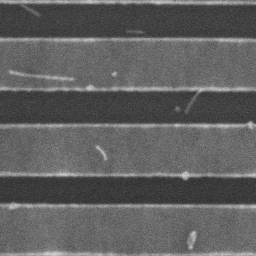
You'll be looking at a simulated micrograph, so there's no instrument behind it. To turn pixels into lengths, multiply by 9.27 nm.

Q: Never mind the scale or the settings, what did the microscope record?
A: lines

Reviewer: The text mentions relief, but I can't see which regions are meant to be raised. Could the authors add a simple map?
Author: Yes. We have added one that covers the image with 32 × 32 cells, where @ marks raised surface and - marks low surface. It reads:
--------------------------------
--------------------------------
--------------------------------
--------------------------------
--------------------------------
@@@@@@@@@@@@@@@@@@@@@@@@@@@@@@@@
@@@@@@@@@@@@@@@@@@@@@@@@@@@@@@@@
@@@@@@@@@@@@@@@@@@@@@@@@@@@@@@@@
@@@@@@@@@@@@@@@@@@@@@@@@@@@@@@@@
@@@@@@@@@@@@@@@@@@@@@@@@@@@@@@@@
@@@@@@@@@@@@@@@@@@@@@@@@@@@@@@@@
--------------------------------
--------------------------------
--------------------------------
--------------------------------
------------------------------@@
@@@@@@@@@@@@@@@@@@@@@@@@@@@@@@@@
@@@@@@@@@@@@@@@@@@@@@@@@@@@@@@@@
@@@@@@@@@@@@@@@@@@@@@@@@@@@@@@@@
@@@@@@@@@@@@@@@@@@@@@@@@@@@@@@@@
@@@@@@@@@@@@@@@@@@@@@@@@@@@@@@@@
@@@@@@@@@@@@@@@@@@@@@@@@@@@@@@@@
--------------------------------
--------------------------------
--------------------------------
-@------------------------------
@@@@@@@@@@@@@@@@@@@@@@@@@@@@@@@@
@@@@@@@@@@@@@@@@@@@@@@@@@@@@@@@@
@@@@@@@@@@@@@@@@@@@@@@@@@@@@@@@@
@@@@@@@@@@@@@@@@@@@@@@@@@@@@@@@@
@@@@@@@@@@@@@@@@@@@@@@@@@@@@@@@@
@@@@@@@@@@@@@@@@@@@@@@@@@@@@@@@@